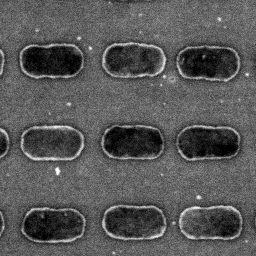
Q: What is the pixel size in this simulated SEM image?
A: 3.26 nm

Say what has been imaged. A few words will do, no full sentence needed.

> a regular array of raised bodies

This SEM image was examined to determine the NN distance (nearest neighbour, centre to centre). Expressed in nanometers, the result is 249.